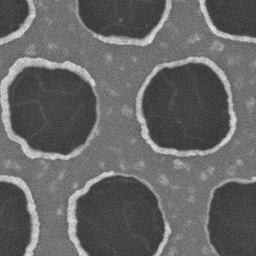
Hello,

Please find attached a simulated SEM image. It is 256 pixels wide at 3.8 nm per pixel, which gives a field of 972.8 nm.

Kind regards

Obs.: holes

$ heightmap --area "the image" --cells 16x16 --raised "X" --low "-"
--XXX-----XXX---
-XXXX-----XXX---
XXXXXXXXXXXXXXXX
XXXXXXXXXXXXXXXX
X----XXXXX---XXX
X-----XXX-----XX
X-----XXX-----XX
X-----XXX-----XX
X-----XXX-----XX
XX---XXXXXXXXXXX
XXXXXXXXXXXXXXXX
-XXXXX---XXXXX--
--XXX-----XXX---
--XXX-----XXX---
--XXX-----XXX---
--XXX-----XXX---